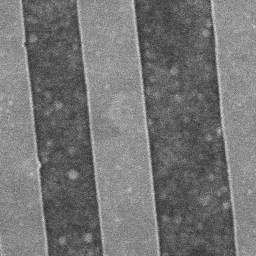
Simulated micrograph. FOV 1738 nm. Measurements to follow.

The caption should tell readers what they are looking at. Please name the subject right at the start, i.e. one or a few lines or trenches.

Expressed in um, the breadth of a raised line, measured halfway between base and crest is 0.378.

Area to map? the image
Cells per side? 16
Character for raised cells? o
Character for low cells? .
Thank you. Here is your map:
o....ooo.....ooo
o....ooo.....ooo
oo...oooo....ooo
oo...oooo.....oo
oo...oooo.....oo
oo...oooo.....oo
oo....ooo.....oo
oo....ooo.....oo
oo....ooo.....oo
oo....ooo.....oo
oo....ooo.....oo
ooo...oooo....oo
ooo...oooo....oo
ooo...oooo.....o
ooo...oooo.....o
ooo...oooo.....o